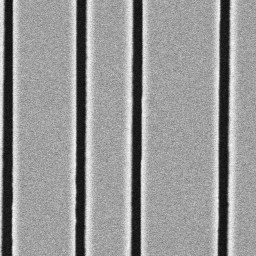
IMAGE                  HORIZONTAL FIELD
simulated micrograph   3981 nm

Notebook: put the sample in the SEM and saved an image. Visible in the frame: lines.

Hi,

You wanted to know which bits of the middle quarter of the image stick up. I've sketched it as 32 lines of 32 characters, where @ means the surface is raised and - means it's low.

@@@--@@@@@@@@@@@@---@@@@@@@@@@@@
@@@--@@@@@@@@@@@@---@@@@@@@@@@@@
@@@--@@@@@@@@@@@@---@@@@@@@@@@@@
@@@--@@@@@@@@@@@@---@@@@@@@@@@@@
@@@--@@@@@@@@@@@@---@@@@@@@@@@@@
@@@--@@@@@@@@@@@@---@@@@@@@@@@@@
@@@--@@@@@@@@@@@@---@@@@@@@@@@@@
@@@--@@@@@@@@@@@@---@@@@@@@@@@@@
@@@--@@@@@@@@@@@@---@@@@@@@@@@@@
@@@--@@@@@@@@@@@@---@@@@@@@@@@@@
@@@--@@@@@@@@@@@@---@@@@@@@@@@@@
@@@--@@@@@@@@@@@@---@@@@@@@@@@@@
@@@--@@@@@@@@@@@@---@@@@@@@@@@@@
@@@--@@@@@@@@@@@@---@@@@@@@@@@@@
@@@--@@@@@@@@@@@@---@@@@@@@@@@@@
@@@--@@@@@@@@@@@@---@@@@@@@@@@@@
@@@--@@@@@@@@@@@@---@@@@@@@@@@@@
@@@--@@@@@@@@@@@@---@@@@@@@@@@@@
@@@--@@@@@@@@@@@@---@@@@@@@@@@@@
@@@--@@@@@@@@@@@@---@@@@@@@@@@@@
@@@--@@@@@@@@@@@@---@@@@@@@@@@@@
@@@--@@@@@@@@@@@@---@@@@@@@@@@@@
@@@--@@@@@@@@@@@@---@@@@@@@@@@@@
@@@--@@@@@@@@@@@@---@@@@@@@@@@@@
@@@--@@@@@@@@@@@@--@@@@@@@@@@@@@
@@@--@@@@@@@@@@@@--@@@@@@@@@@@@@
@@@--@@@@@@@@@@@@--@@@@@@@@@@@@@
@@@--@@@@@@@@@@@@--@@@@@@@@@@@@@
@@@--@@@@@@@@@@@@--@@@@@@@@@@@@@
@@@--@@@@@@@@@@@@--@@@@@@@@@@@@@
@@@--@@@@@@@@@@@@--@@@@@@@@@@@@@
@@@--@@@@@@@@@@@@--@@@@@@@@@@@@@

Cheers